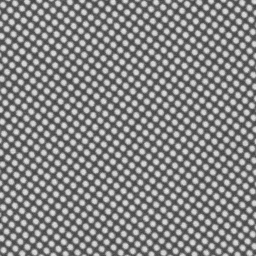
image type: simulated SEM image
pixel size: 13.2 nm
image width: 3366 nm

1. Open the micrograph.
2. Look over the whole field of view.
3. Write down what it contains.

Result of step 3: a regular array of raised bodies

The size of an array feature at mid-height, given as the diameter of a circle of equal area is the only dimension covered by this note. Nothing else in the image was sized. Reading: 0.0757 um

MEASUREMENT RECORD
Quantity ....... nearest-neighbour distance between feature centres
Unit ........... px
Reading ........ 8.36